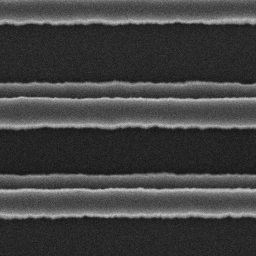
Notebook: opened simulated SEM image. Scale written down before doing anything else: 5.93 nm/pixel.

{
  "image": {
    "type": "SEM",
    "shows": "lines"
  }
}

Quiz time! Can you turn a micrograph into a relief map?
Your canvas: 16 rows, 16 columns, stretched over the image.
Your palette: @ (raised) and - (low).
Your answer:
@@@@@@@@@@@@@@@@
----------------
----------------
----------------
----------------
@@@@@@@@@@@@@@@@
@@@@@@@@@@@@@@@@
@@@@@@@@@@@@@@@@
----------------
----------------
----------------
@@@@@@@@@@@@@@@@
@@@@@@@@@@@@@@@@
-@-@--@---------
----------------
----------------